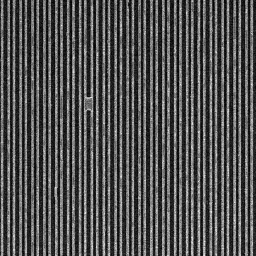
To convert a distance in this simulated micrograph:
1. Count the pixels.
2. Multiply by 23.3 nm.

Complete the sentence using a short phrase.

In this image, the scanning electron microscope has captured parallel lines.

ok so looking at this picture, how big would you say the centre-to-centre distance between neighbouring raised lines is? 139 nm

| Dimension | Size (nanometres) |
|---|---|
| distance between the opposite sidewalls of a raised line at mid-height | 40.8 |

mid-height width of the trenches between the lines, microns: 0.0991